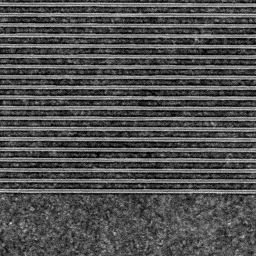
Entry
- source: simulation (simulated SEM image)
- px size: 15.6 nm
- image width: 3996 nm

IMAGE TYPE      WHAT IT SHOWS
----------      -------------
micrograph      parallel lines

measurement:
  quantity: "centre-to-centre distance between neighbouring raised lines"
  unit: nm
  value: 162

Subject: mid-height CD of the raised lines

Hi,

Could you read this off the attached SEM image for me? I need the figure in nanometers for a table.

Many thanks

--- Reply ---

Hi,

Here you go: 33.2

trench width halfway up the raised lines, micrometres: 0.129